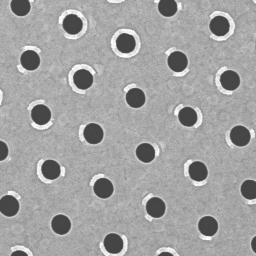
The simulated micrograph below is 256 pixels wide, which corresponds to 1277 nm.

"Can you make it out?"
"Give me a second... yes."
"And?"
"a regular array of holes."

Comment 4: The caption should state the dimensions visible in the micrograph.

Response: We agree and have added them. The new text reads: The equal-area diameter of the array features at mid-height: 99.3 nm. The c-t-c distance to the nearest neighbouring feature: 55.3 pixels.